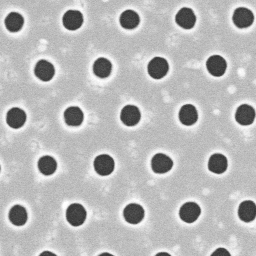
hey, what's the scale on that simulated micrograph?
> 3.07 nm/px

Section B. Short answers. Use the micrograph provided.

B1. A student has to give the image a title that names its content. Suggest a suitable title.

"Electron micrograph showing a regular array of holes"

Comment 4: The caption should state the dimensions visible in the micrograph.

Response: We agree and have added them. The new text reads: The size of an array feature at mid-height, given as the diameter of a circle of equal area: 67.4 nanometers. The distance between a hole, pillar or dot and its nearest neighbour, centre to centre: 171 nm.